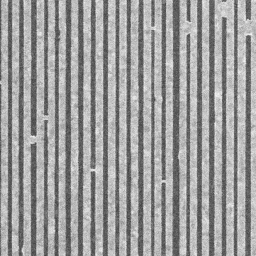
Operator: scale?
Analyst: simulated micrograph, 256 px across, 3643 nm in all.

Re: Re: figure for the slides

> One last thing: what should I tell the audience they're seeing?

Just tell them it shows parallel lines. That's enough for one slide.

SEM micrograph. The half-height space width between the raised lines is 74.7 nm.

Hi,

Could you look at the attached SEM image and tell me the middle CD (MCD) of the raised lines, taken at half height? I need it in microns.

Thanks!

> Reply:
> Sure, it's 0.0943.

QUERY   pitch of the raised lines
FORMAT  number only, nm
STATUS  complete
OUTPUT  169